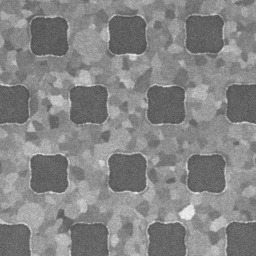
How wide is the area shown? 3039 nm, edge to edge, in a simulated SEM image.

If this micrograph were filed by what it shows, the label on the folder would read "a regular array of holes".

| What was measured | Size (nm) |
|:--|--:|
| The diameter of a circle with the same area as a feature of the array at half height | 503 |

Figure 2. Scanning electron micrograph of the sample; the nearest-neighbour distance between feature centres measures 0.922 microns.